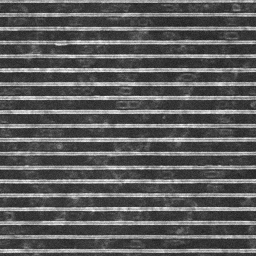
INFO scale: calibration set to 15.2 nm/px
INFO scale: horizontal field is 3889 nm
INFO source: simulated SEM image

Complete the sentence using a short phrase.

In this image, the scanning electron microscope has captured parallel lines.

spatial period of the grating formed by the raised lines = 211 nanometres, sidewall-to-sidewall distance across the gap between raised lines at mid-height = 167 nm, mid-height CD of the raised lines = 47.5 nm